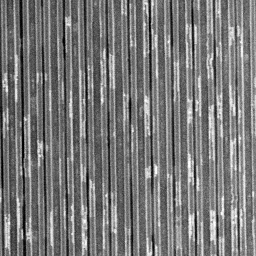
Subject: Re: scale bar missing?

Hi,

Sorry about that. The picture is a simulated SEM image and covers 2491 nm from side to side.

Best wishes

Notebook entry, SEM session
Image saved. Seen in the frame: parallel lines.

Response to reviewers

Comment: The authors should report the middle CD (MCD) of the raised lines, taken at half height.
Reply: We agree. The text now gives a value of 48.6 nanometres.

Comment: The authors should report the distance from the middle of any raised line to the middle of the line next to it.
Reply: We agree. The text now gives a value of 104 nanometres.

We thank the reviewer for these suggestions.